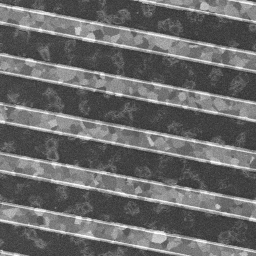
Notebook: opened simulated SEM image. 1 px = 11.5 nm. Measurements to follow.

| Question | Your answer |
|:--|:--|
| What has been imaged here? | parallel lines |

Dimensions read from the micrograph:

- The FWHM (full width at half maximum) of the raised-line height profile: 0.184 microns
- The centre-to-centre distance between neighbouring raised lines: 559 nm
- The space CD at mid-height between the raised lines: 369 nanometres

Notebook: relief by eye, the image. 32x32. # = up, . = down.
....................###########.
####.....................#######
#########......................#
....###########.................
.........###########............
..............###########.......
....................##########..
###......................#######
########......................##
...###########..................
.........##########.............
..............##########........
..................###########...
##......................########
########......................##
..###########...................
.......###########..............
.............##########.........
..................###########...
#......................#########
######......................####
.###########....................
......###########...............
............##########..........
.................##########.....
#.....................##########
######.....................#####
###########.....................
......##########................
...........###########..........
................###########.....
.....................###########